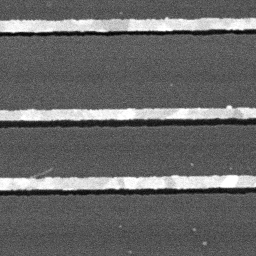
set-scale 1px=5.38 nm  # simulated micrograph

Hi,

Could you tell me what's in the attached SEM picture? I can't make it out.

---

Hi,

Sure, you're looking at lines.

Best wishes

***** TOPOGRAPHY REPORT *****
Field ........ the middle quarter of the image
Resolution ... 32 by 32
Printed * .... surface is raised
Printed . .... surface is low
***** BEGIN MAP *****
********************************
********************************
********************************
********************************
********************************
********************************
********************************
********************************
********************************
********************************
********************************
********************************
********************************
********************************
................................
................................
********************************
********************************
********************************
********************************
********************************
********************************
********************************
********************************
********************************
********************************
********************************
********************************
********************************
********************************
********************************
................................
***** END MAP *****